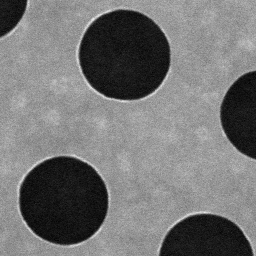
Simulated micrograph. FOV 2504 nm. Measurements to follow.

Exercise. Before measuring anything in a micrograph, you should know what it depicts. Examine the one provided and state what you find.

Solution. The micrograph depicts holes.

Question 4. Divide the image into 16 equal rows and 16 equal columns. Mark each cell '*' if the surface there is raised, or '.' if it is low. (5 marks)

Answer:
..**************
.*****....******
*****.....******
*****......*****
*****.....******
******....****..
**************..
**************..
**************..
***************.
**....**********
*......*********
*......*********
*......*****..**
**....*****....*
**********......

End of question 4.